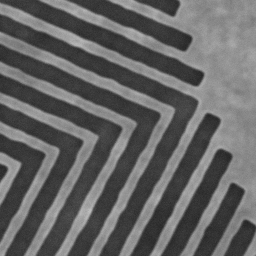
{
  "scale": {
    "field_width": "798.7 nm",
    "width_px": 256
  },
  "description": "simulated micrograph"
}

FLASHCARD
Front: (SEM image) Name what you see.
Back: groups of lines, slits or small figures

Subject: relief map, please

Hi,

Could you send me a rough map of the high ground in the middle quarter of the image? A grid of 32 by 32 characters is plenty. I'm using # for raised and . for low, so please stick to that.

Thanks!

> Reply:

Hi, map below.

###............######...........
#####............######.........
..######...........######.......
....#######...........######....
......#######...........######..
........#######...........######
...........######...........####
##............######...........#
####...........#######..........
.#####............######........
...######...........#######.....
.....######............#####....
.......######...........###.....
..........######........###.....
##...........#####......##.....#
###...........####.....###.....#
######.........##.....###.....##
..######......###.....###.....##
....#####.....##......##.....###
.....###.....###.....###.....##.
.....###.....###.....##.....###.
....###.....###.....###.....##..
....###.....##.....###.....###..
...###.....###.....###.....###..
...##......##.....###.....###...
..###.....###.....###.....##....
..##.....###.....###.....###....
.###.....###.....###.....##.....
.###....###.....###.....###.....
###.....##......##......##.....#
##.....###.....###.....###.....#
##.....###....###.....###.....##